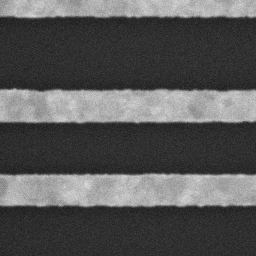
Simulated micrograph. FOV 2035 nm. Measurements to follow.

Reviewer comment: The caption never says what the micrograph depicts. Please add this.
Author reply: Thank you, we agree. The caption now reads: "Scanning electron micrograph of lines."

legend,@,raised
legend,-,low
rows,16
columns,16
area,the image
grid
@@@@@@@@@@@@@@@@
----------------
----------------
----------------
----------------
----------------
@@@@@@@@@@@@@@@@
@@@@@@@@@@@@@@@@
----------------
----------------
----------------
@@@@@@@@@@@@@@@@
@@@@@@@@@@@@@@@@
----------------
----------------
----------------